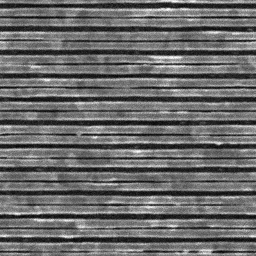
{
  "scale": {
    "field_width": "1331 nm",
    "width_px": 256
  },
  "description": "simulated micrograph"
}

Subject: parallel lines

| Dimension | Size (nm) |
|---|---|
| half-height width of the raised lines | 39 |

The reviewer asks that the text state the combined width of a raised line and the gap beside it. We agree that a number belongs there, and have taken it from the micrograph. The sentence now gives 61 nm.